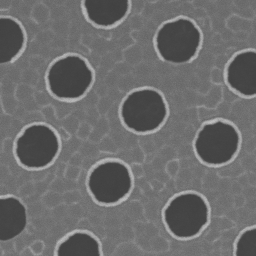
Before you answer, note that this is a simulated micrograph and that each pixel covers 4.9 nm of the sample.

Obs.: holes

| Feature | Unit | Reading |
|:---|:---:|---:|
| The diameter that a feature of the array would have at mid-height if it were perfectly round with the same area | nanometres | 206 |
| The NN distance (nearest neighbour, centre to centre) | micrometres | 0.381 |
